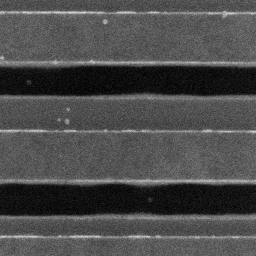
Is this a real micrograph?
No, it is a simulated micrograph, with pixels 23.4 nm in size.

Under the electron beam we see lines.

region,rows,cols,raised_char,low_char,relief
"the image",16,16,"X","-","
XXXXXXXXXXXXXXXX
XXXXXXXXXXXXXXXX
XXXXXXXXXXXXXXXX
XXXXXXXXXXXXXXXX
----------------
----------------
XXXXXXXXXXXXXXXX
XXXXXXXXXXXXXXXX
XXXXXXXXXXXXXXXX
XXXXXXXXXXXXXXXX
XXXXXXXXXXXXXXXX
----------------
----------------
----------------
XXXXXXXXXXXXXXXX
XXXXXXXXXXXXXXXX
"